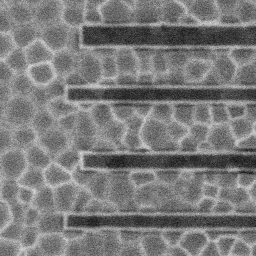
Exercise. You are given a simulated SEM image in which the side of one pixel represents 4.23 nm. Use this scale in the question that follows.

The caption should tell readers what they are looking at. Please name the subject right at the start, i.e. one or a few lines or trenches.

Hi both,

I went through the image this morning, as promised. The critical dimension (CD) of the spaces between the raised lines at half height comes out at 184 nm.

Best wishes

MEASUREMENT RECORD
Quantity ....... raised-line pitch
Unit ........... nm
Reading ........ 262